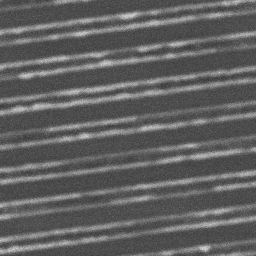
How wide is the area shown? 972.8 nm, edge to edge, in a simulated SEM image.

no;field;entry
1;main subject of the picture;parallel lines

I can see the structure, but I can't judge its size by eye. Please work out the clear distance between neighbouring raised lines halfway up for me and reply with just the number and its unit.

19.1 pixels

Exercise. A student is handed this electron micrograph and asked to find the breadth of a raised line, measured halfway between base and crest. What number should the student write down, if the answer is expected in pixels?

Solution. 15.6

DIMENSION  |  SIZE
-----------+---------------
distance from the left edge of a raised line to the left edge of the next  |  131 nm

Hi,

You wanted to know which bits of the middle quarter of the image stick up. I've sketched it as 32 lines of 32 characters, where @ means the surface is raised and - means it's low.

@@@@@@@@@@----------------------
@@@@----------------------------
--------------------------------
-------------------------@@@@@@@
------------------@@@@@@@@@@@@@@
-----------@@@@@@@@@@@@@@@@@@@@@
--@@@@@@@@@@@@@@@@@@@@@@@@@@@@@-
@@@@@@@@@@@@@@@@@@@@@@@@--------
@@@@@@@@@@@@@@@@----------------
@@@@@@@@@-----------------------
@-------------------------------
-------------------------------@
------------------------@@@@@@@@
----------------@@@@@@@@@@@@@@@@
--------@@@@@@@@@@@@@@@@@@@@@@@@
-@@@@@@@@@@@@@@@@@@@@@@@@@@@@---
@@@@@@@@@@@@@@@@@@@@@-----------
@@@@@@@@@@@@@-------------------
@@@@@@--------------------------
--------------------------------
----------------------------@@@@
--------------------@@@@@@@@@@@@
-------------@@@@@@@@@@@@@@@@@@@
-----@@@@@@@@@@@@@@@@@@@@@@@@@@@
@@@@@@@@@@@@@@@@@@@@@@@@@@@-----
@@@@@@@@@@@@@@@@@@@-------------
@@@@@@@@@@@---------------------
@@@-----------------------------
--------------------------------
--------------------------@@@@@@
------------------@@@@@@@@@@@@@@
-----------@@@@@@@@@@@@@@@@@@@@@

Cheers